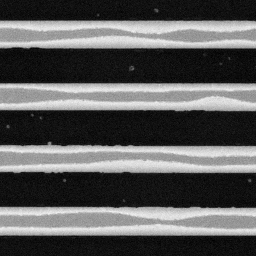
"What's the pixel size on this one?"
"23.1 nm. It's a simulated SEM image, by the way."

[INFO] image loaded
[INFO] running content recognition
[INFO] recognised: lines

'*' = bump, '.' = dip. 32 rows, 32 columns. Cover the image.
................................
................................
................................
********************************
********************************
********************************
................................
................................
................................
................................
................................
********************************
********************************
*...............................
................................
................................
................................
................................
********.************...........
********************************
********************************
................................
................................
................................
................................
................................
********************************
********************************
********************************
................................
................................
................................